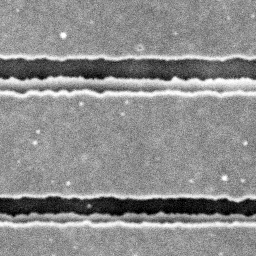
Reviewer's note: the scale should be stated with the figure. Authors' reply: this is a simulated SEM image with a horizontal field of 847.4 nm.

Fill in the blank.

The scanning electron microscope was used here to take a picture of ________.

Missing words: lines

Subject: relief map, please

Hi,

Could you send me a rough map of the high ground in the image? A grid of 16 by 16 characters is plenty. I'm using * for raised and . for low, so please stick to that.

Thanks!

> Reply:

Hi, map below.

****************
****************
****************
****************
................
................
****************
****************
****************
****************
****************
****************
................
................
****************
****************